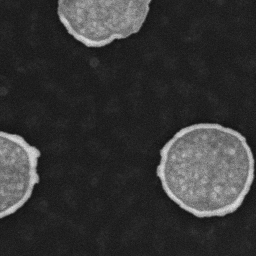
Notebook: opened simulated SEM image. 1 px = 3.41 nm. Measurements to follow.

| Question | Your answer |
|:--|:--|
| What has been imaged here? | raised bodies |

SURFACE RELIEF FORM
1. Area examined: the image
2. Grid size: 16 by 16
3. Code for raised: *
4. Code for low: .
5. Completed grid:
....*****.......
....*****.......
.....**.........
................
................
................
................
................
*..........****.
**........******
**........******
**........******
**.........****.
............**..
................
................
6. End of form